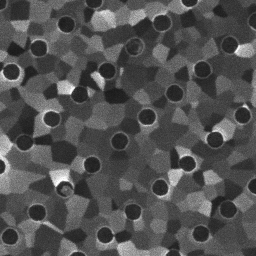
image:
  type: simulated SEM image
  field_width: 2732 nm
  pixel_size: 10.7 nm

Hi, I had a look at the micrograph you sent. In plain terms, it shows a regular array of holes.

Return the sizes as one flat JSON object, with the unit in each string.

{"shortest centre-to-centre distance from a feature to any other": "388 nm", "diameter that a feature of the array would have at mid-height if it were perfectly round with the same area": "180 nanometers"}